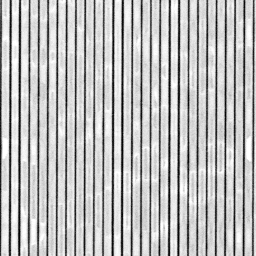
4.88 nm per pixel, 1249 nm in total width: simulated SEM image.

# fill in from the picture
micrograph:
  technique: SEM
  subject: parallel lines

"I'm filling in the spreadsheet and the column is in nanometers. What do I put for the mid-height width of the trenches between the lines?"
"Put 8.5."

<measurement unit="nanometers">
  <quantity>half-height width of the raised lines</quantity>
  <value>37.2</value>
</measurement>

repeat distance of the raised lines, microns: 0.0457